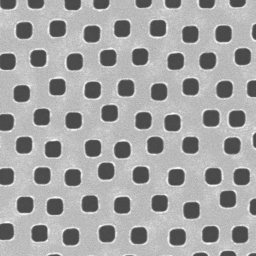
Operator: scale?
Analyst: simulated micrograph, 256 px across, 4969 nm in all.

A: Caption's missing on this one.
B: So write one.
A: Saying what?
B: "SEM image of a regular array of holes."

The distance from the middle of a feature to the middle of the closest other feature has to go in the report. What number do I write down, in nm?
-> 583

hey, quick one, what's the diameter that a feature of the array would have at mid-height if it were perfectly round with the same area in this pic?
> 0.355 micrometres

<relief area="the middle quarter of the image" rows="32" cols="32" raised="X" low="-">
X----XXXXX--XXXXXXXXXXXXXX----XX
X---XXXXXXXXXXXXXXXXXXXXXXX-XXXX
XXXXXXXXXXXXXXXXXXXXXXXXXXXXXXXX
XXXXXXXXXXXXXXXXXXXXXXXXXXXXXXXX
XXXXXX---XXXXX---XXXXXXXXXXXXX--
-XXXX----XXXX-----XXXX----XXX---
XXXXX----XXXX-----XXXX----XXX---
XXXXX----XXXXX---XXXXX----XXXX--
XXXXXX--XXXXXXXXXXXXXX----XXXXXX
XXXXXXXXXXXXXXXXXXXXXXXXXXXXXXXX
XXXXXXXXXX---XXXXXXXXXXXXXXXXXXX
XXXXXXXXX-----XXXXXXXXXXXXXXXXXX
X---XXXXX-----XXXX----XXXXXXXXXX
-----XXXX----XXXXX----XXX----XXX
-----XXXXX--XXXXXX----XXX----XXX
----XXXXXXXXXXXXXX----XXX----XXX
XXXXXXXXXXXXXXXXXXX-XXXXXX---XXX
XXXXXXXXXXXXXXXXXXXXXXXXXXXXXXXX
XXXXXXXXXXXXXXXXXXXXX---XXXXXX--
XXXXXX---XXXXX--XXXXX----XXXXX--
XXXXX-----XX-----XXXX----XXXX---
XXXXX-----XX-----XXXX----XXXXX--
XXXXX----XXXX---XXXXXX-XXXXXXXX-
XXXXXXXXXXXXXX-XXXXXXXXXXXXXXXXX
XXXXXXXXXX--XXXXXXXXXXXXXXXXXXXX
XXXXXXXXX----XXXXX--XXXXXXXXXXXX
X---XXXX-----XXXX----XXXXXX---XX
----XXXX-----XXXX----XXXXX----XX
----XXXXX---XXXXX----XXXXX----XX
----XXXXXXXXXXXXX----XXXXX----XX
X--XXXXXXXXXXXXXXXXXXXXXXXX--XXX
XXXXXXXXXXXXXXXXXXXXXXXXXXXXXXXX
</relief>